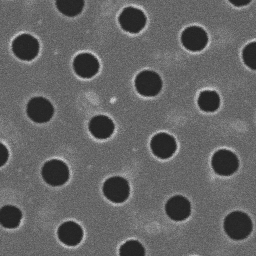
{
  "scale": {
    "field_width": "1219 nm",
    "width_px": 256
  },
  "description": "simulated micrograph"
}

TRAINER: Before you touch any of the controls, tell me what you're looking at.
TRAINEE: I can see a regular array of holes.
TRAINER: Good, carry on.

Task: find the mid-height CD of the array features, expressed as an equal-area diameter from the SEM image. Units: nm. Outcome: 128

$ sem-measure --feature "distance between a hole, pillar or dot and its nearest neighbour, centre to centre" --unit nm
300